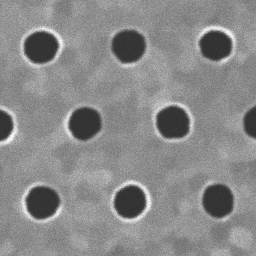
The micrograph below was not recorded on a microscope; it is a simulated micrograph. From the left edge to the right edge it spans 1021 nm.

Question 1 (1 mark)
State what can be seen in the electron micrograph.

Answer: a regular array of holes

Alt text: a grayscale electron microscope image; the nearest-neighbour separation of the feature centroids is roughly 87.8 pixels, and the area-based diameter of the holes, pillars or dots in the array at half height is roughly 33.7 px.